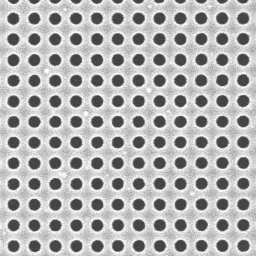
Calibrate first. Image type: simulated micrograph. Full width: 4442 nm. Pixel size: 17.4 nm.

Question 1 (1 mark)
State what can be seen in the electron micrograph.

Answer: a regular array of holes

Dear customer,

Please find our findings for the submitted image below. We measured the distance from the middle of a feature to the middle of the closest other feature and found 356 nanometres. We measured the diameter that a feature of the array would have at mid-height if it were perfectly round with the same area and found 221 nanometres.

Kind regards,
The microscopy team